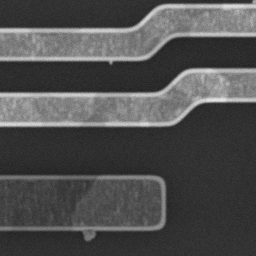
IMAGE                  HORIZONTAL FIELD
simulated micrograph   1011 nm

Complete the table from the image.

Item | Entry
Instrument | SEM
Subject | groups of lines, slits or small figures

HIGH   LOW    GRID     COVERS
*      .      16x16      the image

..........******
.........*******
**********......
*********.......
............****
..........******
************....
***********.....
................
................
................
**********......
**********......
**********......
................
................